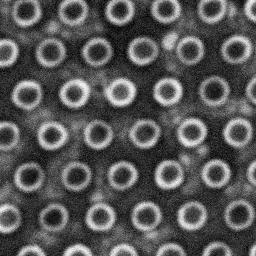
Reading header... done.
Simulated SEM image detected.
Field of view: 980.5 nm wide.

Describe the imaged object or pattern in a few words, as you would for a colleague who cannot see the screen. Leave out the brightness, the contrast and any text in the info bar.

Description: a regular array of raised bodies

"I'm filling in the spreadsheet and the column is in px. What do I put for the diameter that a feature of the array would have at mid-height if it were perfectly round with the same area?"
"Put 25.8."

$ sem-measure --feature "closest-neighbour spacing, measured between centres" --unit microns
0.177